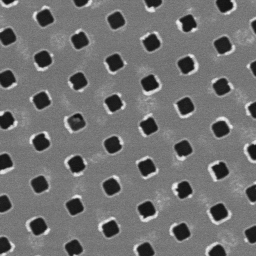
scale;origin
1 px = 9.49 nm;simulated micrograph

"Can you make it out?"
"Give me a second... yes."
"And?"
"a regular array of holes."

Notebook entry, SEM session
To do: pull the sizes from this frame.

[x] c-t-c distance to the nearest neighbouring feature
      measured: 390 nm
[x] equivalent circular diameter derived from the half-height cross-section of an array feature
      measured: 159 nanometers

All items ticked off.